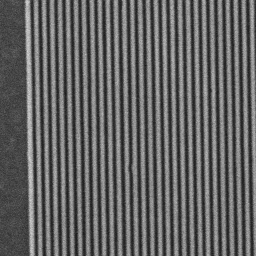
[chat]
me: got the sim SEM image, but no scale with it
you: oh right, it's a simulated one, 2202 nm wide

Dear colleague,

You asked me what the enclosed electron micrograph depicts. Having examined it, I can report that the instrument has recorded parallel lines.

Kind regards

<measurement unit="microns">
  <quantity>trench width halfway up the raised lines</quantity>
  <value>0.0333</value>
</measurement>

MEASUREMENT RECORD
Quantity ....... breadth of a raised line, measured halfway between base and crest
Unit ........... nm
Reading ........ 33.3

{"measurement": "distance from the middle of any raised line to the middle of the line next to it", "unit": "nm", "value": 68.7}